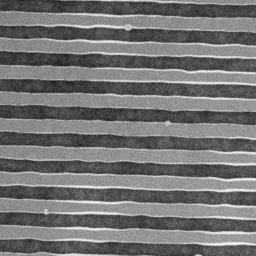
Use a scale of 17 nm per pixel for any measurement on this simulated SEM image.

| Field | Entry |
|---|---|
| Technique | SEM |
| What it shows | groups of lines, slits or small figures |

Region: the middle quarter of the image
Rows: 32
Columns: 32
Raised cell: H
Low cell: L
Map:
LLLLLLLLLLLLLLLLLLLLLLLLLLLLLLLL
HHHHHHHHHHHHHHHHHHHHHHLLLLLLLLLL
HHHHHHHHHHHHHHHHHHHHHHHHHHHHHHHH
HHHHHHHHHHHHHHHHHHHHHHHHHHHHHHHH
LLLLLLLLLLLLLLLLLLLLLLLLLLHHHHHH
LLLLLLLLLLLLLLLLLLLLLLLLLLLLLLLL
LLLLLLLLLLLLLLLLLLLLLLLLLLLLLLLL
LLHHHLLLLLLLLLLLLLLLLLLLLLLLLLLL
HHHHHHHHHHHHHHHHHHHHHHHHHHHHHHHH
HHHHHHHHHHHHHHHHHHHHHHHHHHHHHHHH
LLLLHHHHHHHHHHHHHHHHHHHHHHHHHHHH
LLLLLLLLLLLLLLLLLLLLLLLLLLHHHLLL
LLLLLLLLLLLLLLLLLLLLLLLLLLLLLLLL
LLLLLLLLLLLLLLLLLLLLLLLLLLLLLLLL
HHHHHHHHHHHHHHHHHLLLLLLLLHLLLLLL
HHHHHHHHHHHHHHHHHHHHHHHHHHHHHHHH
HHHHHHHHHHHHHHHHHHHHHHHHHHHHHHHH
LLLLLLLLLLLLHHHHHHHHHHHHHHHHHHHH
LLLLLLLLLLLLLLLLLLLLLLLLLLLLLLLL
LLLLLLLLLLLLLLLLLLLLLLLLLLLLLLLL
LLLLLLLLLLLLLLLLLLLLLLLLLLLLLLLL
HHHHHHHHHHHHHHHHHHHHHHLLLLHLLLLL
HHHHHHHHHHHHHHHHHHHHHHHHHHHHHHHH
HHHHHHHHHHHHHHHHHHHHHHHHHHHHHHHH
LLLLLLLLLLLLLLLLLLHHHHHHHHHHHHHH
LLLLLLLLLLLLLLLLLLLLLLLLLLLLLLLL
LLLLLLLLLLLLLLLLLLLLLLLLLLLLLLLL
HHLLLLLLLLLLLLLLLLLLLLLLLLLLLLLL
HHHHHHHHHHHHHHHHHHHHHHHHHHHHHHHH
HHHHHHHHHHHHHHHHHHHHHHHHHHHHHHHH
LLLLHHHHHHHHHHHHHHHHHHHHHHHHHHHH
LLLLLLLLLLLLLLLLLLLLLLLLLHHLLLHH